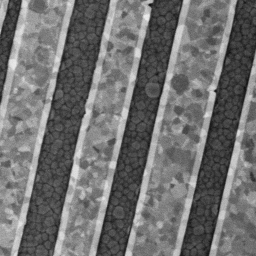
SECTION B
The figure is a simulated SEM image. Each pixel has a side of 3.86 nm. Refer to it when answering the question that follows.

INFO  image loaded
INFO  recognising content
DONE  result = one or a few lines or trenches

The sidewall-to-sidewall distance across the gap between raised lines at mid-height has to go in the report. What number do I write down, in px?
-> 34.6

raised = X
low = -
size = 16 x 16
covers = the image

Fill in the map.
--XX---XX---XXX-
-XXX---XX--XXX--
-XXX---XX--XXX--
-XXX--XXX--XXX--
-XX---XX---XXX--
XXX---XX--XXX---
XXX---XX--XXX--X
XXX--XXX--XXX--X
XXX--XXX--XXX--X
XX---XX--XXXX--X
XX---XX--XXX--XX
XX---XX--XXX--XX
XX--XXX--XXX--XX
X---XX---XXX--XX
X---XX--XXX---XX
X---XX--XXX--XXX